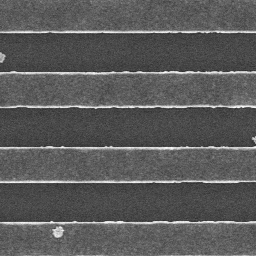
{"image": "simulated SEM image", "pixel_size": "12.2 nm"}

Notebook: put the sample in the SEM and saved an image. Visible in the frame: lines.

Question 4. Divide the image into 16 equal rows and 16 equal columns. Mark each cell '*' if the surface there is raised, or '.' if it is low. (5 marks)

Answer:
****************
****************
................
................
*......**.******
****************
****************
................
................
****************
****************
................
................
................
****************
****************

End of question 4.